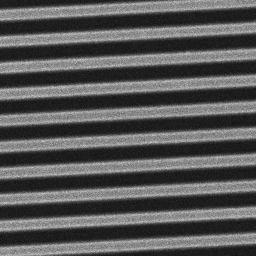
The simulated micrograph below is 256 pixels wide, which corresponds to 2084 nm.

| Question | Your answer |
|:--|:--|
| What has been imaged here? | parallel lines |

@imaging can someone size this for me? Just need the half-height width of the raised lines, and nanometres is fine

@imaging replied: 95.5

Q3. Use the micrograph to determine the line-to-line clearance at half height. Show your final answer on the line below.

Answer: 117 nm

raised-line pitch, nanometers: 214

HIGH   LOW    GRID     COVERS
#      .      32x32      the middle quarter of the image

####################............
##..............................
................................
...............................#
.............###################
################################
##############################..
############....................
................................
................................
..........................######
........########################
################################
#####################...........
###.............................
................................
................................
..................##############
################################
###############################.
#############...................
................................
................................
............................####
..........######################
################################
###########################.....
#########.......................
................................
................................
....................############
..##############################